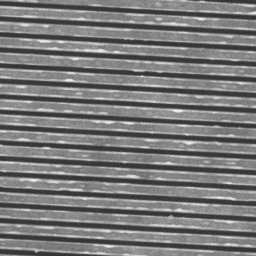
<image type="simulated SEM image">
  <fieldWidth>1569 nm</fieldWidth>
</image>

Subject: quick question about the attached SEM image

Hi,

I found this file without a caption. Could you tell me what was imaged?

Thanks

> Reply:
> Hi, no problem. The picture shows parallel lines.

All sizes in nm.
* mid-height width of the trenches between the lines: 32.9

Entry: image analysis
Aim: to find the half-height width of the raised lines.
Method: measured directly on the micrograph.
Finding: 59.7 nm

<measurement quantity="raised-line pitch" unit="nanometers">95.1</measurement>